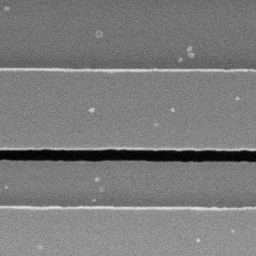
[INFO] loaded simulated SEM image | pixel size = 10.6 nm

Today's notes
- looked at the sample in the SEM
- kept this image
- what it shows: lines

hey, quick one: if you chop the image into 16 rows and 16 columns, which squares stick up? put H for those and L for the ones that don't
LLLLLLLLLLLLLLLL
LLLLLLLLLLLLLLLL
LLLLLLLLLLLLLLLL
LLLLLLLLLLLLLLLL
HHHHHHHHHHHHHHHH
HHHHHHHHHHHHHHHH
HHHHHHHHHHHHHHHH
HHHHHHHHHHHHHHHH
HHHHHHHHHHHHHHHH
LLLLLLLLLLLLLLLL
LLLLLLLLLLLLLLLL
LLLLLLLLLLLLLLLL
LLLLLLLLLLLLLLLL
HHHHHHHHHHHHHHHH
HHHHHHHHHHHHHHHH
HHHHHHHHHHHHHHHH